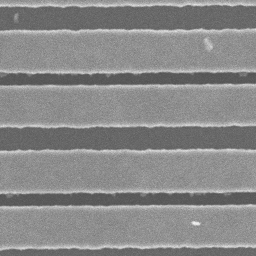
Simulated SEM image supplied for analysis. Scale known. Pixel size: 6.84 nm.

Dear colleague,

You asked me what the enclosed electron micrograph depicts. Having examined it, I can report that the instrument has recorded lines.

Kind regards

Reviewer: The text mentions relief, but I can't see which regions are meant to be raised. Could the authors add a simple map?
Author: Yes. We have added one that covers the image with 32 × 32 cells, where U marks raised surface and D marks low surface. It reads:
UUUUUUUUUUUUUUUUUUUUUUUUUUUUUUUU
DDDDDDDDDDDDDDDDDDDDDDDDDDDDDDDD
DDDDDDDDDDDDDDDDDDDDDDDDDDDDDDDD
DDDDDDDDDDDDDDDDDDDDDDDDDDDDDDDD
UUUUUUUUUUUUUUUUUUUUUUUUUUUUUUUU
UUUUUUUUUUUUUUUUUUUUUUUUUUUUUUUU
UUUUUUUUUUUUUUUUUUUUUUUUUUUUUUUU
UUUUUUUUUUUUUUUUUUUUUUUUUUUUUUUU
UUUUUUUUUUUUUUUUUUUUUUUUUUUUUUUU
DDDDDDDDDDDDDDDDDDDDDDDDDDDDDDDD
DDDDDDDDDDDDDDDDDDDDDDDDDDDDDDDD
UUUUUUUUUUUUUUUUUUUUUUUUUUUUUUUU
UUUUUUUUUUUUUUUUUUUUUUUUUUUUUUUU
UUUUUUUUUUUUUUUUUUUUUUUUUUUUUUUU
UUUUUUUUUUUUUUUUUUUUUUUUUUUUUUUU
UUUUUUUUUUUUUUUUUUUUUUUUUUUUUUUU
DDDDDDDDDDDDDDDDDDDDDDDDDDDDDDDD
DDDDDDDDDDDDDDDDDDDDDDDDDDDDDDDD
DDDDDDDDDDDDDDDDDDDDDDDDDDDDDDDD
UUUUUUUUUUUUUUUUUUUUUUUUUUUUUUUU
UUUUUUUUUUUUUUUUUUUUUUUUUUUUUUUU
UUUUUUUUUUUUUUUUUUUUUUUUUUUUUUUU
UUUUUUUUUUUUUUUUUUUUUUUUUUUUUUUU
UUUUUUUUUUUUUUUUUUUUUUUUUUUUUUUU
DDDDDDDDDDDDDDDDDDDDDDDDDDDDDDDD
DDDDDDDDDDDDDDDDDDDDDDDDDDDDDDDD
UUUUUUUUUUUUUUUUUUUUUUUUUUUUUUUU
UUUUUUUUUUUUUUUUUUUUUUUUUUUUUUUU
UUUUUUUUUUUUUUUUUUUUUUUUUUUUUUUU
UUUUUUUUUUUUUUUUUUUUUUUUUUUUUUUU
UUUUUUUUUUUUUUUUUUUUUUUUUUUUUUUU
DDDDDDDDDDDDDDDDDDDDDDDDDDDDDDDD